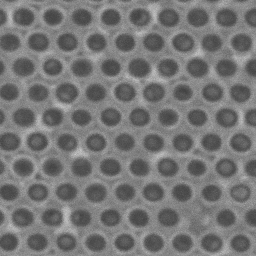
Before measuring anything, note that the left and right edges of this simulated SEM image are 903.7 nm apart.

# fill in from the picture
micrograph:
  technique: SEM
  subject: a regular array of holes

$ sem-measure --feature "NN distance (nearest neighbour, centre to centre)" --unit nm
100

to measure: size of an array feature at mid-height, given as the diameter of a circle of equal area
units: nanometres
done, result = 70.6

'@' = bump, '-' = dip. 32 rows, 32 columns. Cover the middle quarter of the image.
@@-----@@-----@@------@------@@-
@@-----@@-----@@------@@-----@@-
@@-----@@@----@@@----@@@----@@@-
@@@@-@@@@@@@@@@@@@@@@@@@@@@@@--@
@@@@@@@@@@@@@@@@@@@@@@@@@@@-@@@@
---@@@----@@@----@@@@----@@@----
----@-----@@@-----@@-----@@-----
----@------@------@@-----@@-----
---@@@----@@@-----@@-----@@@----
--@@@@@@@@@@@@@-@@@@@@-@@@@@@@@@
@@@@@@@@@@@@@@@@@@@@@@@@@@@@@@@@
@@@--@@@@@---@@@@----@@@----@@@@
@@-----@@-----@@-----@@@-----@@-
@@-----@@-----@@------@------@@-
@@-----@@-----@@@----@@@-----@@-
@@@--@@@@@---@@@@@--@@@@@--@@@@@
@@@@@@@@@@@@@@@@@@@@@@@@@@@@@@@@
--@@@@@--@@@@@--@@@@@--@@@@@@-@@
---@@@----@@@----@@@-----@@-----
---@@------@------@@-----@@-----
---@@@-----@@-----@@-----@@-----
--@@@@@---@@@@---@@@@---@@@@---@
@@@@@@@@@@@@@@@@@@@@@@@@@@@@@@@@
@@@@@@@@@@@-@@@@@@@@@@@@@-@@@@@@
@@-----@@-----@@@----@@@----@@@-
@@-----@@-----@@-----@@------@@-
@@-----@@-----@@-----@@------@@-
@@-----@@@----@@@----@@@----@@@@
@@@@@@@@@@@@@@@@@@@@@@@@@@@@@@@@
@@@@@@@@@@@@@@@@@@@@@@@@@@@@@@@@
---@@@----@@@----@@@----@@@@---@
---@@------@@-----@@-----@@-----